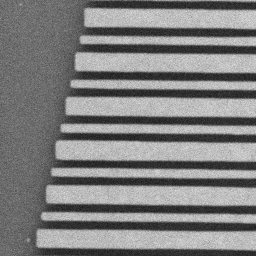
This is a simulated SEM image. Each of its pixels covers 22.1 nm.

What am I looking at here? groups of lines, slits or small figures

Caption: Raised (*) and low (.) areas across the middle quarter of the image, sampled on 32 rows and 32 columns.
...*****************************
...*****************************
................................
................................
..******************************
..******************************
................................
................................
.***************************....
.*******************************
.*******************************
.*******************************
.*******************************
................................
................................
********************************
********************************
................................
................................
********************............
********************************
********************************
********************************
********************************
................................
................................
********************************
********************************
................................
................................
***************.................
********************************